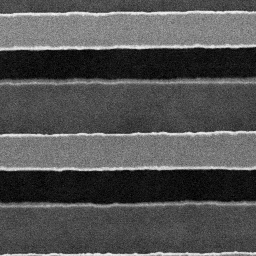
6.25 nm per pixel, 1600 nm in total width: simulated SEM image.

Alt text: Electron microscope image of lines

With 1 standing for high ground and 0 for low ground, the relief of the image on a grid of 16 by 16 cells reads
1111111111111111
1111111111111111
1111111111111111
0000000000000000
0000000000000000
1111111111111111
1111111111111111
1111111111111111
1111111111111111
1111111111111111
1111111111111111
0000000000000000
0000000000000000
1111111111111111
1111111111111111
1111111111111111